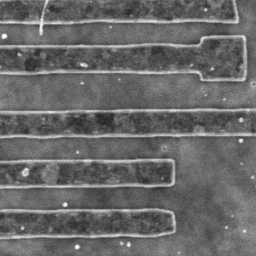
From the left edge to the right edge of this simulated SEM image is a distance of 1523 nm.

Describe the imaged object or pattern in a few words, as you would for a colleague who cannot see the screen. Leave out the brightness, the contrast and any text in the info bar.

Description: wiring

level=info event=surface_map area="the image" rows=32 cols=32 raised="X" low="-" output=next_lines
XXXXXXXXXXXXXXXXXXXXXXXXXXXXX---
XXXXXXXXXXXXXXXXXXXXXXXXXXXXXX--
XXXXXXXXXXXX-XXXXXXXXXX--XXXX---
--------------------------------
--------------------------------
-------------------------XXXXXX-
XXXXXXXXXXXXXXXXXXXXXXXXXXXXXXX-
XXXXXXXXXXXXXXXXXXXXXXXXXXXXXXX-
XXXXXXXXXXXXXXXXXXXXXXXXXXXXXXX-
-------------------------XXXXXX-
--------------------------------
--------------------------------
--------------------------------
--------------------------------
XXXXXXXXXXXXXXXXXXXXXXXXXXXXXXXX
XXXXXXXXXXXXXXXXXXXXXXXXXXXXXXXX
XXXXXXXXXXXXXXXXXXXXXXXXXXXXXXXX
--------------------------------
--------------------------------
--------------------------------
XXXXXXXXXXXXXXXXXXXXXX----------
XXXXXXXXXXXXXXXXXXXXXX----------
XXXXXXXXXXXXXXXXXXXXXX----------
--------------------------------
--------------------------------
--------------------------------
XXXXXXXXXXXXXXXXXXXXX-----------
XXXXXXXXXXXXXXXXXXXXXX----------
XXXXXXXXXXXXXXXXXXXXXX----------
XXXXX-XXXXXXX-------------------
--------------------------------
--------------------------------